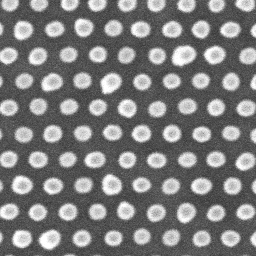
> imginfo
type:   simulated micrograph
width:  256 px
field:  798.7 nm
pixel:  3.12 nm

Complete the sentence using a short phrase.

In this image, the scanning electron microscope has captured a regular array of raised bodies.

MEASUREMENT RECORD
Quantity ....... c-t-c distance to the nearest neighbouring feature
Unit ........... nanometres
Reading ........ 89.5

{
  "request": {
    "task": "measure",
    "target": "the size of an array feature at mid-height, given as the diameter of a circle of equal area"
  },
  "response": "51.2 nanometers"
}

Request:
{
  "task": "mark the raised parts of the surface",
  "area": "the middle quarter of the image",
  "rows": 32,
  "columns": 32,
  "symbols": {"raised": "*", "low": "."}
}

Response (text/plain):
.............................*..
................................
................................
...****...****....***....****...
...****..*****....***....****...
...***...*****....***....***....
..........***...................
................................
................................
***....***....***............***
***....***....****...****....***
***....***....****...****....***
........*.....****....***.......
................................
................................
...........*....................
...***....****....***....****...
...****...****...****....****...
...***.....**.....***....****...
................................
................................
................................
**....***......**.....**......**
***...****....****...****....***
***..*****....****...****....***
*.....***......**.....***.....**
................................
................................
..........***...................
...****...****....***....****...
...****...****...****....****...
...***....****....***....****...